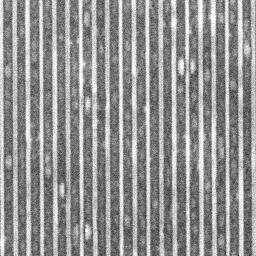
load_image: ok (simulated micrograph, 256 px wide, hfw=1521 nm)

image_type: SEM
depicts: parallel lines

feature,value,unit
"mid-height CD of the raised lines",21.5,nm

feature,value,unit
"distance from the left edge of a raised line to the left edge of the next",78.7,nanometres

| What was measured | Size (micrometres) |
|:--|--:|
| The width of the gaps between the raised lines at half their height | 0.0601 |